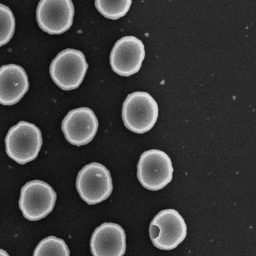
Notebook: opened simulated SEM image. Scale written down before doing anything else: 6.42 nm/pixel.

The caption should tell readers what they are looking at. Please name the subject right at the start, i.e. a regular array of raised bodies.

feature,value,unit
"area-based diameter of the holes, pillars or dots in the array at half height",232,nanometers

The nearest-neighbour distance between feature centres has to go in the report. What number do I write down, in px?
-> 58.9